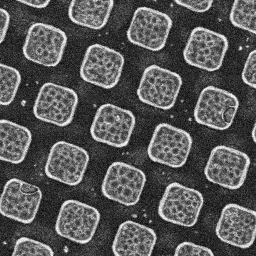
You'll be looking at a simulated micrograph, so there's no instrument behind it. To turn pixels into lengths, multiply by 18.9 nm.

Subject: a regular array of raised bodies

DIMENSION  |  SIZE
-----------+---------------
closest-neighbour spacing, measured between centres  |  1130 nanometres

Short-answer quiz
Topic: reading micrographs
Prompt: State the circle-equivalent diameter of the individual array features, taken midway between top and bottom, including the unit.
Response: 758 nanometers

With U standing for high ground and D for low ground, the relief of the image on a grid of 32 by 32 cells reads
DDDDUUDDDUUUUUDDDDDDDDDUUUDDDUUU
UDDDDDDDDUUUUUDDDUUUDDDDDDDDDUUU
UDDDDDDDDUUUUDDDDUUUUDDDDDDDDUUU
UDDDUUUDDDDDDDDDUUUUUDDDDDDDDDDU
DDDDUUUUDDDDDDDDUUUUUDDDUUUUDDDD
DDDUUUUUDDDDDDDDDUUUDDDDUUUUDDDD
DDDUUUUUDDDUUUDDDDDDDDDUUUUUDDDD
DDDDUUUDDDDUUUUDDDDDDDDUUUUUDDDU
UDDDDDDDDDUUUUUDDDDUDDDDDDUDDDDU
UUDDDDDDDDUUUUUDDDUUUUDDDDDDDDUU
UUDDDDDDDDDDUUDDDDUUUUDDDDDDDDDU
UUDDDUUUUDDDDDDDDUUUUUDDDUUUDDDD
UDDDDUUUUDDDDDDDDDUUUUDDDUUUUDDD
DDDDUUUUUDDDDUUDDDDDDDDDDUUUUDDD
DDDDDUUUUDDDUUUUDDDDDDDDDUUUUDDD
UUDDDDDUDDDDUUUUUDDDDDDDDUUUUDDD
UUUDDDDDDDDDUUUUDDDUUUUDDDDDDDDD
UUUUDDDDDDDDUUUUDDDUUUUUDDDDDDDD
UUUDDDDUUUDDDDDDDDDUUUUUDDDDDDDD
UUUDDDUUUUUDDDDDDDDUUUUDDDUUUUUD
DDDDDDUUUUUDDDDDDDDDDUUDDDUUUUUD
DDDDDDUUUUDDDDUUUUDDDDDDDDUUUUUD
DDDDDDDUUUDDDUUUUUDDDDDDDDUUUUDD
DUUDDDDDDDDDDUUUUUDDDUUDDDDDDDDD
UUUUUDDDDDDDDDUUUDDDDUUUUDDDDDDD
UUUUUDDDUUDDDDDDDDDDUUUUUDDDDDDD
UUUUDDDDUUUUDDDDDDDDUUUUUDDDUUUD
DDUUDDDUUUUUDDDDDDDDDUUUDDDDUUUU
DDDDDDDUUUUUDDDUUUDDDDDDDDDUUUUU
DDDDDDDDUUUDDDDUUUUDDDDDDDDUUUUU
DDUUUDDDDDDDDDUUUUUDDDDUDDDDDUUD
DDUUUUDDDDDDDDUUUUUDDDUUUUDDDDDD